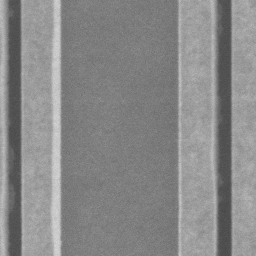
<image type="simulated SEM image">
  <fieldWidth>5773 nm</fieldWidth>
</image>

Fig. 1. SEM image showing lines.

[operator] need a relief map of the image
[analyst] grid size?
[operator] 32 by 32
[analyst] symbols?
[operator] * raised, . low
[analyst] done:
*..****...............*****..***
*..****...............*****..***
*..****...............*****..***
*..****...............*****..***
*..****...............*****..***
*..****...............*****..***
*..****...............*****..***
*..****...............*****..***
*..****...............*****..***
*..****...............*****..***
*..****...............*****..***
*..****...............*****..***
*..****...............*****..***
*..****...............*****..***
*..****...............*****..***
*..****...............*****..***
*..****................****..***
*..****................****..***
*..****...............*****..***
*..****...............*****..***
*..****...............*****..***
*..****................****..***
*..****................****..***
*..****................****..***
*..****................****..***
*..****................****..***
*..****................****..***
*..****...............*****..***
*..****...............*****..***
*..****................****..***
*..****...............*****..***
*..****...............*****..***